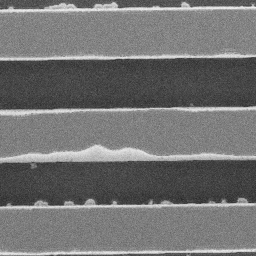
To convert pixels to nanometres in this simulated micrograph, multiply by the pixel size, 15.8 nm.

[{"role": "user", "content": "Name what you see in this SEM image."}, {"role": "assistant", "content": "lines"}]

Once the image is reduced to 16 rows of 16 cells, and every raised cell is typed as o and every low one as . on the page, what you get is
............oooo
oooooooooooooooo
oooooooooooooooo
oooooooooooooooo
................
................
................
oooooooooooooooo
oooooooooooooooo
oooooooooooooooo
................
................
................
oooooooooooooooo
oooooooooooooooo
oooooooooooooooo